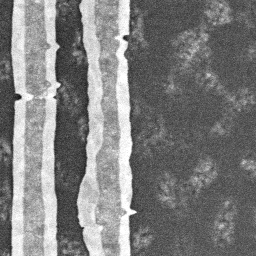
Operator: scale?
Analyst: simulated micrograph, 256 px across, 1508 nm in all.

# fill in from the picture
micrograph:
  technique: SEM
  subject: one or a few lines or trenches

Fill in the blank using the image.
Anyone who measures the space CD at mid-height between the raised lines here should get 239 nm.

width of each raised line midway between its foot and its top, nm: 193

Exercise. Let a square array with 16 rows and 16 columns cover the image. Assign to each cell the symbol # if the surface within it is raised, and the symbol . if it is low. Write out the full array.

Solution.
.##..###........
.##..###........
.##...##........
.##...##........
.##...##........
.##...##........
.##...##........
.##...##........
.##...##........
.##...##........
.##...##........
.##..###........
.##..###........
.##..###........
.##...##........
.##...##........